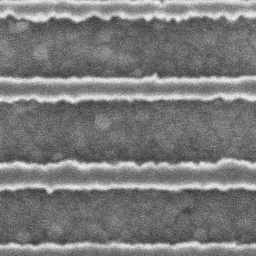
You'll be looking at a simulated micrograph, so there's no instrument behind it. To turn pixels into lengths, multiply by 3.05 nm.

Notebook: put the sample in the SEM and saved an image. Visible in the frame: one or a few lines or trenches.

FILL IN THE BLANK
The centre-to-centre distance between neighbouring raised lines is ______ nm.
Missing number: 258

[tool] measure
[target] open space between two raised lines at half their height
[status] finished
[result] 190 nanometers